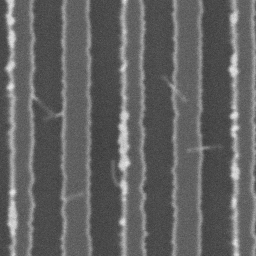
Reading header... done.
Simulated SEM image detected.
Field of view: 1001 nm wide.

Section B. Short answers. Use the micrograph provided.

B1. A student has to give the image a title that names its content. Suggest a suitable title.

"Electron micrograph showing lines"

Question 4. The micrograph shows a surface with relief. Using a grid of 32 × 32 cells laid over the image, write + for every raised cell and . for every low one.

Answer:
.+++....+++.....++....+++....+++
.+++....+++.....++....+++....+++
.+++....+++....+++....+++....+++
.+++....+++.....++....+++....+++
.+++....+++.....++....+++....+++
.+++....+++.....++....+++....+++
.+++....+++....+++....+++....+++
.+++....+++.....++....+++....+++
.+++....+++....+++....+++....+++
.+++....+++.....++....+++....+++
.+++....+++.....++....+++....+++
.+++....+++....+++....+++....+++
..++....+++.....++....+++....+++
..++....+++....+++....+++....+++
..++....+++....+++....+++....+++
..++....+++....+++....+++....+++
.+++....+++....+++....+++....+++
.+++....+++....+++....+++....+++
..++....+++....+++....+++....+++
..++....+++....+++....+++....+++
..++....+++....+++....+++....+++
..++....+++.....++....+++....+++
..++....+++....+++....+++....+++
.+++....+++....+++....+++....+++
.+++....+++....+++....+++....+++
.+++....+++.....++....+++....+++
.+++....+++.....++....+++....+++
.+++....+++....+++....+++....+++
.+++....+++.....++....+++....+++
..++....+++.....++....+++....+++
..++....+++.....++....+++....+++
..++....+++.....++....+++....+++